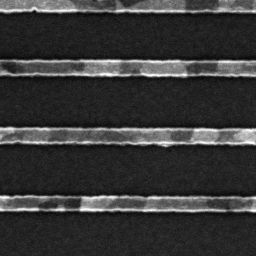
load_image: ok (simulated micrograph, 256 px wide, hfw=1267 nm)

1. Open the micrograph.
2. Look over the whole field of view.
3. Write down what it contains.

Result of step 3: one or a few lines or trenches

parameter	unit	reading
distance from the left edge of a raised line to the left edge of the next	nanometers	336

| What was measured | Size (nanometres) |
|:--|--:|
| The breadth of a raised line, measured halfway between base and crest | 66.2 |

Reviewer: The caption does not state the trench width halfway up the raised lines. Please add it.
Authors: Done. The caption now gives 266 nm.